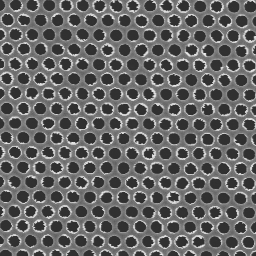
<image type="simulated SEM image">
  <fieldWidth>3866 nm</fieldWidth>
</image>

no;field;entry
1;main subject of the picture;a regular array of holes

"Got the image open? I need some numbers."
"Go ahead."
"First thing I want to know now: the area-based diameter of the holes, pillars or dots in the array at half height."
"0.17 micrometres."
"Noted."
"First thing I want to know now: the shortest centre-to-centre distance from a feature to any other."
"245 nm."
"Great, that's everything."